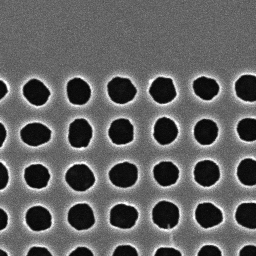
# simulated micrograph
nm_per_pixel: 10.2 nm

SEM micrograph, a regular array of holes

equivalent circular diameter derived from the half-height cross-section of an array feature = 276 nm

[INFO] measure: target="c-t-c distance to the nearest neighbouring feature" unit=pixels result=41.3